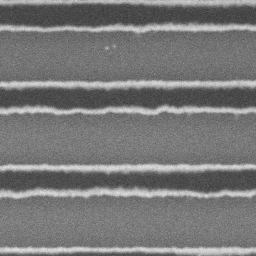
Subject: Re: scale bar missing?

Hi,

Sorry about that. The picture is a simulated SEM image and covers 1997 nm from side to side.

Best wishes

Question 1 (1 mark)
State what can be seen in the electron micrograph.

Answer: lines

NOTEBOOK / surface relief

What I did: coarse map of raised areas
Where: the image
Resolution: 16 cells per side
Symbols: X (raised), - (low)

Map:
XXXXXXXXXXXXXXXX
XXXXXXXXXXXXXXXX
----------------
----------------
----------------
XXXXXXXXXXXXXXXX
XXXXXXXXXXXXXXXX
----------------
----------------
----------------
XXXXXXXXXXXXXXXX
XXXXXXXXXXXXXXXX
----------------
----------------
----------------
----------------